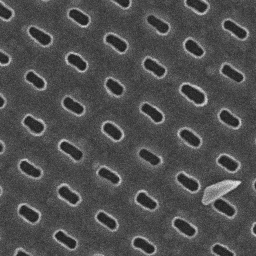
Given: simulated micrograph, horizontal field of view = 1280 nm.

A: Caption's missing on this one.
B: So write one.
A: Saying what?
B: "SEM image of a regular array of holes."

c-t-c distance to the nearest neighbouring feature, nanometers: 219